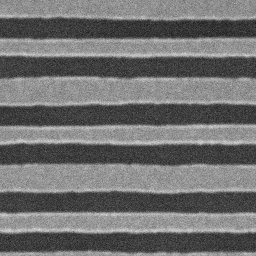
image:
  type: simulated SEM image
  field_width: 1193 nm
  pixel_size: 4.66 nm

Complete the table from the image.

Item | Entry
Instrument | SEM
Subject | lines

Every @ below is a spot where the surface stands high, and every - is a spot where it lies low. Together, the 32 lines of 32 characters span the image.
@@@@@@@@@@@@@@@@@@@@@@@@@@@@@@@@
@@@@@@@@@@@@@@@@@@@@@@@@@@@@@@@@
--------------------------------
--------------------------------
--------------------------------
@@@@@@@@@@@@@@@@@@@@@@@@@@@@@@@@
@@@@@@@@@@@@@@@@@@@@@@@@@@@@@@@@
--------------------------------
--------------------------------
--------------------------------
@@@@@@@@@@@@@@@@@@@@@@@@@@@@@@@@
@@@@@@@@@@@@@@@@@@@@@@@@@@@@@@@@
@@@@@@@@@@@@@@@@@@@@@@@@@@@@@@@@
--------------------------------
--------------------------------
--------------------------------
@@@@@@@@@@@@@@@@@@@@@@@@@@@@@@@@
@@@@@@@@@@@@@@@@@@@@@@@@@@@@@@@@
--------------------------------
--------------------------------
--------------------------------
@@@@@@@@@@@@@@@@@@@@@@@@@@@@@@@@
@@@@@@@@@@@@@@@@@@@@@@@@@@@@@@@@
@@@@@@@@@@@@@@@@@@@@@@@@@@@@@@@@
--------------------------------
--------------------------------
--------------------------------
@@@@@@@@@@@@@@@@@@@@@@@@@@@@@@@@
@@@@@@@@@@@@@@@@@@@@@@@@@@@@@@@@
--------------------------------
--------------------------------
-----------@--------------------